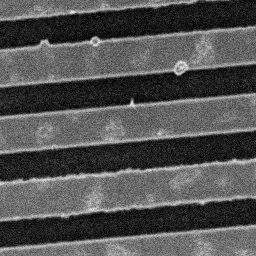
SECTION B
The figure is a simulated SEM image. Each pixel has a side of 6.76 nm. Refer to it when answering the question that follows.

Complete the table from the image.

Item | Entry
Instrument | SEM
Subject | one or a few lines or trenches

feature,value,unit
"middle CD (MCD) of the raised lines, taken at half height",247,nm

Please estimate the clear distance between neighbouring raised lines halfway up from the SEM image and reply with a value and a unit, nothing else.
0.197 micrometres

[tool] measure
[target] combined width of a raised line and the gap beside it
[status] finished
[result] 450 nanometers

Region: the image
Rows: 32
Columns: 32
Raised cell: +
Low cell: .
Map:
++++++++++++++++++++++..........
++++++++++++....................
+...............................
..............................++
..................++++++++++++++
.....+..++++++++++++++++++++++++
++++++++++++++++++++++++++++++++
++++++++++++++++++++++++++++++++
+++++++++++++++++++++++++.......
+++++++++++++++.................
++++............................
................................
.......................+++++++++
............++++++++++++++++++++
..++++++++++++++++++++++++++++++
++++++++++++++++++++++++++++++++
+++++++++++++++++++++++++++++...
++++++++++++++++++..............
++++++++........................
................................
.........................+++++++
...............+++++++++++++++++
....++++++++++++++++++++++++++++
++++++++++++++++++++++++++++++++
++++++++++++++++++++++++++++++++
++++++++++++++++++++++..........
++++++++++++....................
+...............................
.............................+++
..................++++++++++++++
.......+++++++++++++++++++++++++
++++++++++++++++++++++++++++++++